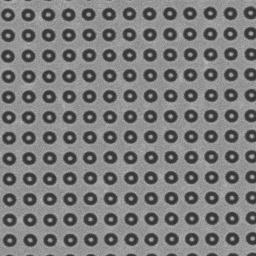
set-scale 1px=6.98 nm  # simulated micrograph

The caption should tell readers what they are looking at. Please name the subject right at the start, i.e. a regular array of ring-shaped grooves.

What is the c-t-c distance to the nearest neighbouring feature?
0.14 um